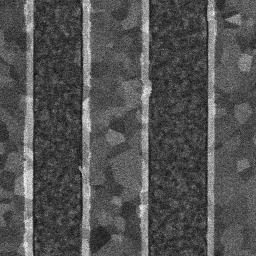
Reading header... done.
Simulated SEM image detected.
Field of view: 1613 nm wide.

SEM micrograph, one or a few lines or trenches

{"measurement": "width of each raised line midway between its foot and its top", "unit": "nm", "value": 385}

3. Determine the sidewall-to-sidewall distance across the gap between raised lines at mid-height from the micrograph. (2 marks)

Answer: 369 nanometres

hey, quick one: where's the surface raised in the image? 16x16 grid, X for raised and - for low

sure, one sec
XX---XXXX----XXX
XX---XXXX----XXX
XX---XXXX----XXX
XX---XXXX----XXX
XX---XXXX----XXX
XX---XXXX----XXX
XX---XXXX----XXX
XX---XXXX----XXX
XX---XXXX----XXX
XX---XXXX----XXX
XX---XXXX----XXX
XX---XXXX----XXX
XX---XXXX----XXX
XX---XXXX----XXX
XX---XXXX----XXX
XX---XXXX----XXX